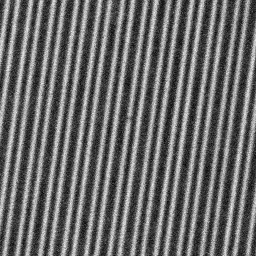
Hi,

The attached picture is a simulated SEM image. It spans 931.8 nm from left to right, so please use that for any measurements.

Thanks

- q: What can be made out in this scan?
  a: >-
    parallel lines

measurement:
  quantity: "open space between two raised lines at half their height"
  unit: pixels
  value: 8.16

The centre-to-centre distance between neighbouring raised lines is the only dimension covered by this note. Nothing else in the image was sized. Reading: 41.5 nm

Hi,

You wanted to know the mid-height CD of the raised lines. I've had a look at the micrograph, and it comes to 9.9 nm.